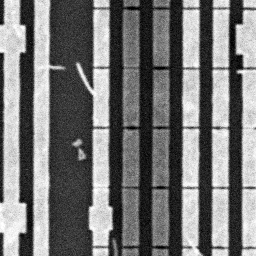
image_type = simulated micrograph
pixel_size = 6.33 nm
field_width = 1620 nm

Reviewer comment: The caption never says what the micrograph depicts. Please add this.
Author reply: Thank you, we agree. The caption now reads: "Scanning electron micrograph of wiring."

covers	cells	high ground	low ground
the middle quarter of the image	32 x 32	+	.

........+++....++++...++++....++
........+++....++++...++++....++
........+++....++++...++++....++
........+++....++++...++++....++
........+++....++++...++++....++
........+++....++++...++++....++
.......++++....++++...++++....++
.......++++....++++...++++....++
........+++....++++...++++....++
........+++....++++...++++....++
........+++....++++...++++....++
........+++....++++...++++....++
........+++....++++...++++....++
.......++++....++++...++++....++
........+++....++++...++++....++
........+++....++++...++++....++
........+++....++.....++++....++
.......++++....++++...++++....++
.......++++....++++...++++....++
.......++++....++++...++++....++
.......++++....++++...++++....++
.......++++....++++...++++....++
....+..++++....++++...++++....++
....+..++++....++++...++++....++
.......++++....++++...++++....++
.......++++....++++...++++....++
.......++++....++++...++++....++
.......++++....++++...++++....++
.......++++....++++...++++....++
.......++++....++++...++++....++
........+++....++++...++++....++
.......++++....++++...++++....++